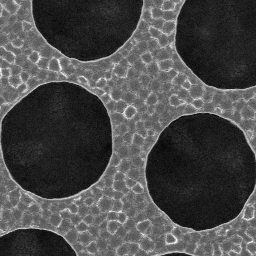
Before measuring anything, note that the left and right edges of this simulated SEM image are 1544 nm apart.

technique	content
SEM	holes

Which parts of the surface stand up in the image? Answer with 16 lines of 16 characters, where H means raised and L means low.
HHLLLLLLLHHLLLLL
HHLLLLLLLHHLLLLL
HHHLLLLLHHHLLLLL
HHHHLLLHHHHLLLLL
HHHHHHHHHHHHLLLL
HHLLLHHHHHHHHHLH
HLLLLLHHHHHHHHHH
LLLLLLLHHHHLLLHH
LLLLLLLHHHLLLLLH
LLLLLLLHHLLLLLLL
LLLLLLLHHLLLLLLL
HLLLLLHHHLLLLLLL
HHHHHHHHHHLLLLLH
HHHHHHHHHHLLLLLH
HLLHHHHHHHHHHHHH
LLLLHHHHHHHHHHHH